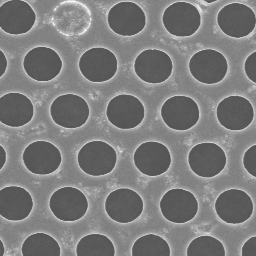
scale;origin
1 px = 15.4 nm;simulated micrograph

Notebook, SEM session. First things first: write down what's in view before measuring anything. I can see a regular array of holes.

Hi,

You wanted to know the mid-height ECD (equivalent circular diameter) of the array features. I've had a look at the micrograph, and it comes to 561 nm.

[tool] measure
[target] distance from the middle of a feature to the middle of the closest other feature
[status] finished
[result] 0.827 um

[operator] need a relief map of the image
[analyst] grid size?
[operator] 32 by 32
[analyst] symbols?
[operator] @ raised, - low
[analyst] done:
---@@@@@@@@@@@@--@@@@@--@@@@@-@@
----@@@@@@@@@@----@@-----@@-----
----@@@@@@@@@-----@@-----@@-----
----@@@@@@@@@@----@@@----@@@----
@@@@@@@@@@@@@@@@@@@@@@--@@@@@--@
@@@@@@@@@@@@@@@@@@@@@@@@@@@@@@@@
@@@@---@@@@---@@@@--@@@@@--@@@@@
-@@-----@@-----@@----@@@----@@@-
-@@-----@@-----@@-----@@----@@@-
@@@@---@@@@---@@@----@@@----@@@-
@@@@@@@@@@@@@@@@@@@@@@@@@@@@@@@@
@@@@@@@@@@@@@@@@@@@@@@@@@@@@@@@@
----@@@----@@@---@@@@---@@@@---@
----@@-----@@-----@@-----@@-----
----@@-----@@-----@@-----@@-----
@--@@@@---@@@@---@@@@---@@@@---@
@@@@@@@@@@@@@@@@@@@@@@@@@@@@@@@@
@@@@@@@@@@@@@@@@@@@@@@@@@@@@@@@@
@@@----@@@----@@@----@@@----@@@-
-@@-----@@-----@@----@@@----@@--
-@@-----@@----@@@----@@@----@@--
@@@@---@@@@---@@@@---@@@----@@@-
@@@@@@@@@@@@@@@@@@@@@@@@@@@@@@@@
@--@@@@@-@@@@@@-@@@@@@@@@@@@@@@@
----@@@----@@@---@@@----@@@----@
----@@-----@@-----@@-----@@-----
----@@@----@@-----@@-----@@-----
@@-@@@@@-@@@@@---@@@@---@@@@---@
@@@@@@@@@@@@@@@@@@@@@@@@@@@@@@@@
@@@@--@@@@@--@@@@@--@@@@@-@@@@@@
@@@----@@@----@@@----@@@----@@@-
-@@----@@@----@@-----@@-----@@--